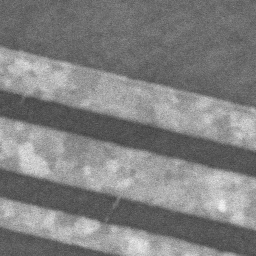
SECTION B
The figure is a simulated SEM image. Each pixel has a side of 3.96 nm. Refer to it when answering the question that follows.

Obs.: one or a few lines or trenches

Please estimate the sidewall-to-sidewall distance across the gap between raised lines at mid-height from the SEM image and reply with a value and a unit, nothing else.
124 nanometres